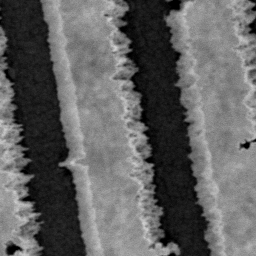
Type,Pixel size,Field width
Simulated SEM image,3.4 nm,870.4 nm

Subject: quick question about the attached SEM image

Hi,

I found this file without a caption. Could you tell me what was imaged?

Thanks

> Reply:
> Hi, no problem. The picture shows one or a few lines or trenches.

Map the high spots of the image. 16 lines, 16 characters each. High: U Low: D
DDDUUUUDDDDUUUUD
DDDUUUUDDDDUUUUD
DDDDUUUUDDDUUUUD
DDDDUUUUDDDDUUUD
DDDDUUUUDDDDUUUU
DDDDUUUUDDDDUUUU
DDDDUUUUDDDDUUUU
DDDDUUUUUDDDUUUU
UDDDDUUUUDDDUUUU
UDDDDUUUUDDDDUUU
UDDDDUUUUDDDDUUU
UDDDDUUUUDDDDUUU
UDDDDUUUUDDDDUUU
UUDDDUUUUDDDDUUU
UUDDDDUUUDDDDUUU
UUDDDDUUUUDDDDUU